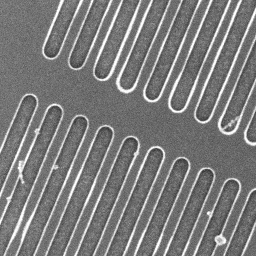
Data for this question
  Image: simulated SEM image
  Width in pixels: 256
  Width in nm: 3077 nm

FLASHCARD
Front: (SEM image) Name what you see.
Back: groups of lines, slits or small figures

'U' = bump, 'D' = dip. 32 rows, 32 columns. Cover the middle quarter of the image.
UUDDUUUUDDDDUUUDDDDDUUUDDDDUUUDD
UUUUUUUUDDDDUUUDDDDUUUDDDDDUUUDD
UUUUUUUUDDDDUUDDDDDUUUDDDDUUUDDD
UUUUUUUUDDDUUUDDDDDUUDDDDDUUUDDD
UUUUUUUUUUUUUDDDDDUUUDDDDDUUDDDD
UUUUUUUUUUUUUUDDDDUUDDDDDUUUDDDD
UUUUUUUUUUUUUUUDDUUUDDDDDUUDDDDD
UUUUUUUUUUUUUUUUUUUUDDDDUUUDDDDD
UUUUUUUUUUUUUUUUUUUUDDDDUUUDDDDU
UUUUUUUUUUUUUUUUUUUUUUUUUUDDDDDU
UUUUUUUUUUUUUUUUUUUUUUUUUUUDDDDU
UUUUUUUUUUUUUUUUUUUUUUUUUUUDDDUU
UUUUUUUUUUUUUUUUUUUUUUUUUUUUUUUU
UUUDDUUUUUUUUUUUUUUUUUUUUUUUUUUU
UUDDDDUUUUUUUUUUUUUUUUUUUUUUUUUU
UUDDDDUUUUDUUUUUUUUUUUUUUUUUUUUU
UDDDDDUUUDDDUUUUUUUUUUUUUUUUUUUU
UDDDDUUUDDDDUUUUUUUUUUUUUUUUUUUU
DDDDDUUUDDDDUUUUDDUUUUUUUUUUUUUU
DDDDUUUDDDDDUUUDDDDUUUUUUUUUUUUU
DDDDUUUDDDDUUUDDDDDUUUUUUUUUUUUU
DDDUUUDDDDDUUUDDDDUUUDDDDUUUUUUU
DDDUUUDDDDDUUDDDDDUUUDDDDUUUUUUU
DDDUUUDDDDUUUDDDDDUUDDDDDUUUUDUU
DDUUUDDDDDUUUDDDDUUUDDDDDUUUDDDU
DDUUUDDDDUUUDDDDDUUDDDDDUUUDDDDU
DDUUDDDDDUUUDDDDUUUDDDDDUUUDDDDU
DUUUDDDDDUUDDDDDUUUDDDDUUUDDDDDU
DUUDDDDDUUUDDDDUUUUDDDDUUUDDDDUU
UUUDDDDDUUUDDDDUUUDDDDUUUUDDDDUU
UUUDDDDUUUDDDDDUUUDDDDUUUDDDDUUU
UUDDDDDUUUDDDDUUUDDDDDUUUDDDDUUU